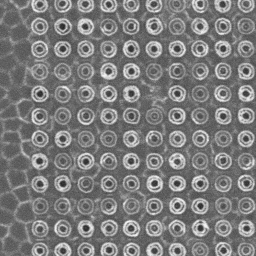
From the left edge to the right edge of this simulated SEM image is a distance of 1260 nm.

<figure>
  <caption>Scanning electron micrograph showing a regular array of ring-shaped raised bodies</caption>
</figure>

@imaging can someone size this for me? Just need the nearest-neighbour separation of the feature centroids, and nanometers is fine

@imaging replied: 109